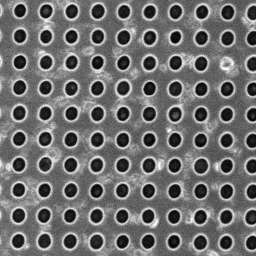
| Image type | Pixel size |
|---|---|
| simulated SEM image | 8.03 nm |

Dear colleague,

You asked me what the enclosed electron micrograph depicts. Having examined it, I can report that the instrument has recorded a regular array of holes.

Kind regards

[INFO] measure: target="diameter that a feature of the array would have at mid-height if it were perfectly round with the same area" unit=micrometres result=0.109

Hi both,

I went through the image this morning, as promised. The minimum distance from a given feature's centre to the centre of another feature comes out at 204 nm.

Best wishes